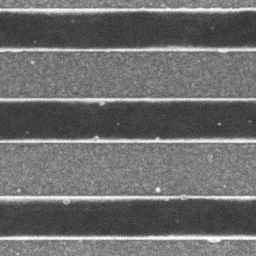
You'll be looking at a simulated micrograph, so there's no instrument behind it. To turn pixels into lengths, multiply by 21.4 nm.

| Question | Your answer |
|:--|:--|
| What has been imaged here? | lines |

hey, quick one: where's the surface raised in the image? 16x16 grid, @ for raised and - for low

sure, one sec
----------------
@@@@@@@@@@@@@@@@
@@@@@@@@@@@@@@@@
----------------
----------------
----------------
@@@@@@@@@@@@@@@@
@@@@@@@@@@@@@@@@
@@@@@@@@@@@@@@@@
----------------
----------------
----------------
@@@@@@@@@@@@@@@@
@@@@@@@@@@@@@@@@
@@@@@@@@@@@@@@@@
----------------